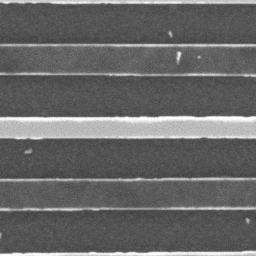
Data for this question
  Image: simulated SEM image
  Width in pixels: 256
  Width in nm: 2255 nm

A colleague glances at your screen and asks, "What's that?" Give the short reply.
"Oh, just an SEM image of lines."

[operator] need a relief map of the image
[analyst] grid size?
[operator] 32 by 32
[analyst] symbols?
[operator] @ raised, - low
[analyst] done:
--------------------------------
--------------------------------
--------------------------------
--------------------------------
--------------------------------
--------------------------------
@@@@@@@@@@@@@@@@@@@@@@@@@@@@@@@@
@@@@@@@@@@@@@@@@@@@@@@@@@@@@@@@@
@@@@@@@@@@@@@@@@@@@@@@@@@@@@@@@@
--------------------------------
--------------------------------
--------------------------------
--------------------------------
--------------------------------
--------------------------------
@@@@@@@@@@@@@@@@@@@@@@@@@@@@@@@@
@@@@@@@@@@@@@@@@@@@@@@@@@@@@@@@@
--------------------------------
--------------------------------
--------------------------------
--------------------------------
--------------------------------
@@@@@@@@@@@@@@@@@@@@@@@@@@@@@@@@
@@@@@@@@@@@@@@@@@@@@@@@@@@@@@@@@
@@@@@@@@@@@@@@@@@@@@@@@@@@@@@@@@
@@@@@@@@@@@@@@@@@@@@@@@@@@@@@@@@
--------------------------------
--------------------------------
--------------------------------
--------------------------------
--------------------------------
------------------------------@@